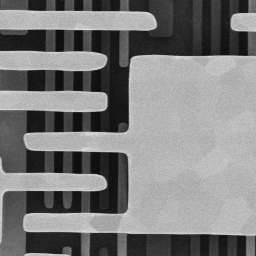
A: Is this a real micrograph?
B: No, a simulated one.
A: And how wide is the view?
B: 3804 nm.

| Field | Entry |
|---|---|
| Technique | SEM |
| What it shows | wiring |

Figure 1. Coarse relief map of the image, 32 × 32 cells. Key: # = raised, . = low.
................................
##################..............
###################..........###
###################..........###
................................
................................
#####...........................
#############...################
#############...################
................################
................################
############....################
#############...################
#############...################
................################
................################
................################
...#############################
...#############################
................################
................################
#...............################
#############...################
#############...################
................################
................################
................################
...#############################
...#############################
................................
................................
................................